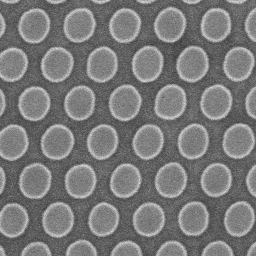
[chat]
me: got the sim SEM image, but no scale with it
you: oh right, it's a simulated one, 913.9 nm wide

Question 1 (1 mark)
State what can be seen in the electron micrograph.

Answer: a regular array of raised bodies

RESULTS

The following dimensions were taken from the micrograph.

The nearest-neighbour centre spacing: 160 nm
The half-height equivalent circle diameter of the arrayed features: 116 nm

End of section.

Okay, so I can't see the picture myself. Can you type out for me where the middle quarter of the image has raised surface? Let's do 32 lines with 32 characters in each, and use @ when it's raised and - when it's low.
@@----@@@@@@@----@@@@@@@----@@@@
@@----@@@@@@@----@@@@@@@----@@@@
@-----@@@@@@@-----@@@@@@-----@@@
-------@@@@@------@@@@@------@@@
--------------------------------
---------------@----------@-----
--@@@@@------@@@@@------@@@@@@--
-@@@@@@-----@@@@@@@-----@@@@@@--
-@@@@@@-----@@@@@@@----@@@@@@@--
@@@@@@@-----@@@@@@@----@@@@@@@--
@@@@@@@-----@@@@@@@----@@@@@@@--
-@@@@@@-----@@@@@@@----@@@@@@@--
-@@@@@@-----@@@@@@-----@@@@@@---
--@@@@-------@@@@--------@@-----
--------------------------------
---------@@---------@@@--------@
@------@@@@@@------@@@@@------@@
@@-----@@@@@@-----@@@@@@@----@@@
@@----@@@@@@@-----@@@@@@@----@@@
@@----@@@@@@@----@@@@@@@@----@@@
@@----@@@@@@@----@@@@@@@@----@@@
@@----@@@@@@@-----@@@@@@-----@@@
@------@@@@@------@@@@@-------@@
--------@@@--------@@@---------@
--------------------------------
---@@@--------@@@--------@@@@---
-@@@@@@------@@@@@------@@@@@@--
-@@@@@@@----@@@@@@@----@@@@@@@--
@@@@@@@@----@@@@@@@----@@@@@@@@-
@@@@@@@@----@@@@@@@----@@@@@@@--
@@@@@@@@----@@@@@@@----@@@@@@@--
-@@@@@@-----@@@@@@-----@@@@@@@--